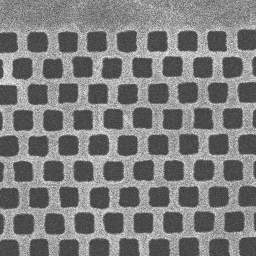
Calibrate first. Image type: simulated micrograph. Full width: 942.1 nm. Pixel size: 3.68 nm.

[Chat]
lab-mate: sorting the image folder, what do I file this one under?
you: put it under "a regular array of holes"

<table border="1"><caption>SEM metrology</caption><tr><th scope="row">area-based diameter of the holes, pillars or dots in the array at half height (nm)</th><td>82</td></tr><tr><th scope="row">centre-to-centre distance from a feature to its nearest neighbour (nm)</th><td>107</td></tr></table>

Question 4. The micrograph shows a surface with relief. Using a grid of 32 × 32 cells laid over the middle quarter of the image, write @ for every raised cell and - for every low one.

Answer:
@@-----@@@-----@@-----@@@-----@@
@@-----@@@----@@@-----@@@-----@@
@@-----@@-----@@@-----@@@-----@@
@@@@@@@@@@----@@@@@@-@@@@@@@@@@@
@@@@@@@@@@@@@@@@@@@@@@@@@@@@@@@@
---@@@-----@@@----@@@-----@@----
----@@-----@@@----@@@-----@@----
----@@-----@@-----@@@-----@@----
----@@-----@@------@@-----@@----
---@@@-----@@@----@@@-----@@@---
@@@@@@@@@@@@@@@@@@@@@@@@@@@@@@@@
@@@@@-@@@@-----@@-----@@@----@@@
@@-----@@@-----@@-----@@@-----@@
@@-----@@@-----@@-----@@@-----@@
@@-----@@@-----@@-----@@@----@@@
@@-----@@@-----@@-----@@@----@@@
@@@-@-@@@@@@@@@@@@@@@@@@@@--@@@@
@@@@@@@@@@@@@@@@@@@@@@@@@@@@@@@@
---@@@-----@@@----@@@-----@@@---
----@@-----@@------@@-----@@@---
----@@-----@@------@@-----@@@---
----@@-----@@------@@-----@@@---
---@@@-----@@@----@@@-----@@@@--
@@@@@@@@@@@@@@@@@@@@@@@@@@@@@@@@
@@@----@@@----@@@@----@@@@----@@
@@-----@@@-----@@------@@-----@@
@@@----@@@-----@@------@@-----@@
@@@----@@@-----@@-----@@@-----@@
@@@-----@@-----@@-----@@@-----@@
@@@@@@@@@@@@@@@@@@@@@@@@@@@@@@@@
-@@@@@@@@@@@@@@@@@@@@@@@-@@@@@@@
----@@@----@@@----@@@-----@@----